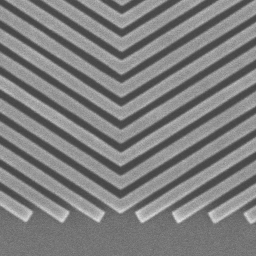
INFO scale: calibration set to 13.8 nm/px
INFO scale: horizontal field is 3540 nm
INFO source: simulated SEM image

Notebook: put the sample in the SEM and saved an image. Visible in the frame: groups of lines, slits or small figures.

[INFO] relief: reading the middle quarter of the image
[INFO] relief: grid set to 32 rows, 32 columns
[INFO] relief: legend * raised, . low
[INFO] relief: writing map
..*****....*******....*****....*
....*****...****....******...***
**...*****........******...*****
***....*****.....*****....*****.
****....******.******...******..
.*****....*********....*****....
..******...******....******...**
....*****....***....*****....***
**....*****.......*****....*****
****...*****....******...******.
*****...******.*****....*****...
.*****....*********...******...*
...*****....*****....*****....**
*...*****....**....******...****
**....*****.......*****....*****
****...******...*****....*****..
*****....***********...******...
.******...********....*****....*
...******...*****...******...***
*....*****....*...******....****
**....*****......******...******
****....*****...*****....*****..
******...**********....*****....
..*****....*******...******....*
...******...****....*****....***
*....*****........******...*****
***...******.....*****....*****.
****....*****..******...******..
.*****....*********....*****....
..*****....******....******...**
....*****....***....*****...****
*....*****........*****....*****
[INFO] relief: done